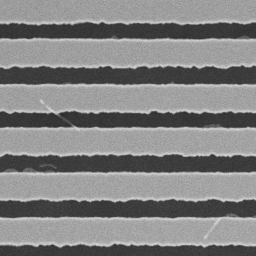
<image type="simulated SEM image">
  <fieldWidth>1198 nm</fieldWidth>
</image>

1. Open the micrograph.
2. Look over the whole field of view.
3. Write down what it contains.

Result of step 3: lines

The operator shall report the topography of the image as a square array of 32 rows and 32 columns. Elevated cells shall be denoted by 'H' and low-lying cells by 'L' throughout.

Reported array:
HHHHHHHHHHHHHHHHHHHHHHHHHHHHHHHH
HHHHHHHHHHHHHHHHHHHHHHHHHHHHHHHH
HHHHHHHHHHHHHHHHHHHHHHHHHHHHHHHH
LLLLLLLLLLLLLLLLLLLLLLLLLLLLLLLL
LLLLLLLLLLLLLLLLLLLLLLLLLLLLLLLL
HHHHHHHHHHHHHHHHHHHHHHHHHHHHHHHH
HHHHHHHHHHHHHHHHHHHHHHHHHHHHHHHH
HHHHHHHHHHHHHHHHHHHHHHHHHHHHHHHH
LLLLLLLLLLLLLLHLLLLLLLLLLLLLLLLL
LLLLLLLLLLLLLLLLLLLLLLLLLLLLLLLL
LLLLLLLLLLHLLHLLLLLLLHLLHHLLLLLL
HHHHHHHHHHHHHHHHHHHHHHHHHHHHHHHH
HHHHHHHHHHHHHHHHHHHHHHHHHHHHHHHH
HHHHHHHHHHHHHHHHHHHHHHHHHHHHHHHH
LLLLLLLLLLLLLLLLLLLLLLLLLLLLLLLL
LLLLLLLLLLLLLLLLLLLLLLLLLLLLLLLL
HHHHHHHHHHHHHHHHHHHHHHHHHHHHHHHH
HHHHHHHHHHHHHHHHHHHHHHHHHHHHHHHH
HHHHHHHHHHHHHHHHHHHHHHHHHHHHHHHH
LLLLHLLHHLLHLLLLLLLLLLLHHHLHHLHH
LLLLLLLLLLLLLLLLLLLLLLLLLLLLLLLL
LLLLLLLLLLLLLLLLLLLLLLLLLLLLLLLL
HHHHHHHHHHHHHHHHHHHHHHHHHHHHHHHH
HHHHHHHHHHHHHHHHHHHHHHHHHHHHHHHH
HHHHHHHHHHHHHHHHHHHHHHHHHHHHHHHH
LLLLLLLLLLLLLLLLLLLLLLLLLLLLLLLL
LLLLLLLLLLLLLLLLLLLLLLLLLLLLLLLL
HHHHHHHHHHHHHHHHHHHHHHHHHHHHHHHH
HHHHHHHHHHHHHHHHHHHHHHHHHHHHHHHH
HHHHHHHHHHHHHHHHHHHHHHHHHHHHHHHH
HHHHHHHHHHHHHHLHHHHHHHHHHHHHHHHH
LLLLLLLLLLLLLLLLLLLLLLLLLLLLLLLL